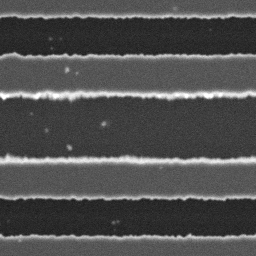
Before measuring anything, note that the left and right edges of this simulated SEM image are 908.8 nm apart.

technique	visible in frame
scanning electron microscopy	lines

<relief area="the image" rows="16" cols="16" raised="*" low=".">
****************
................
................
**.*************
****************
****************
................
................
................
................
****************
****************
................
................
................
****************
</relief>